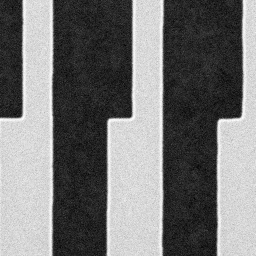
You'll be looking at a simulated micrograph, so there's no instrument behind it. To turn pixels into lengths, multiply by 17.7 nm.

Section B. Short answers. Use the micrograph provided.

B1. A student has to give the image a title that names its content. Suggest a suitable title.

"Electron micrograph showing wiring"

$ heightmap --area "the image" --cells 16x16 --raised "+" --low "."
.++.....++.....+
.++.....++.....+
.++.....++.....+
.++.....++.....+
.++.....++.....+
.++.....++.....+
.++.....++.....+
+++....+++....++
+++....+++....++
+++....+++....++
+++....+++....++
+++....+++....++
+++....+++....++
+++....+++....++
+++....+++....++
+++....+++....++